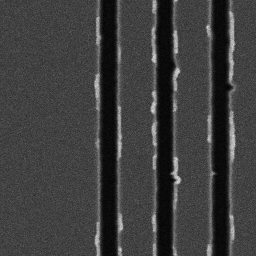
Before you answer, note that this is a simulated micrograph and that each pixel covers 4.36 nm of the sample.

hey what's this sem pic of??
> parallel lines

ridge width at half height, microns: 0.181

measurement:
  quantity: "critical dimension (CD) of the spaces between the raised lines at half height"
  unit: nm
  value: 63.2